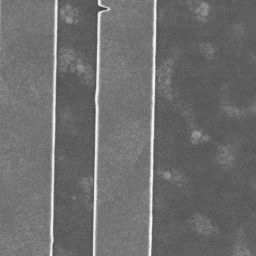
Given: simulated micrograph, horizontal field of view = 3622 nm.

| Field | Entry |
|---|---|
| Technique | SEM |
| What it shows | one or a few lines or trenches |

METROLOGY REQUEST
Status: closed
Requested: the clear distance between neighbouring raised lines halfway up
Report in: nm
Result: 592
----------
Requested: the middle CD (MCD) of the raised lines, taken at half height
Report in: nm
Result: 803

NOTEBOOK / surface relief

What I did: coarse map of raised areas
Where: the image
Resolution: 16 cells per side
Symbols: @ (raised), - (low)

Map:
@@@@--@@@@------
@@@@--@@@@------
@@@---@@@@------
@@@---@@@@------
@@@---@@@@------
@@@---@@@@------
@@@---@@@@------
@@@---@@@@------
@@@---@@@@------
@@@---@@@@------
@@@---@@@-------
@@@---@@@-------
@@@---@@@-------
@@@---@@@-------
@@@---@@@-------
@@@---@@@-------